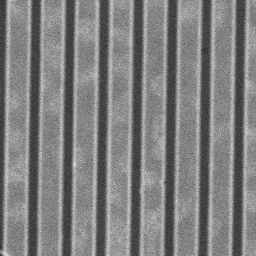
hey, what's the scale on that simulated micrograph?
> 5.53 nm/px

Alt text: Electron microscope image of parallel lines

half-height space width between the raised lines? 0.0587 micrometres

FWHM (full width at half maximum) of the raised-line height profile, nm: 128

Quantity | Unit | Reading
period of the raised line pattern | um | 0.189